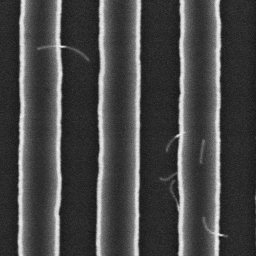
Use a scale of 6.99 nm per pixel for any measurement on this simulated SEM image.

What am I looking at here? lines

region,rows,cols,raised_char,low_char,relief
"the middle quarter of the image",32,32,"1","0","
00000000011111111110000000000111
00000000011111111110000000000111
00000000011111111110000000000111
00000000011111111110000000000111
00000000011111111110000000000111
00000000011111111110000000000111
00000000011111111110000000000111
00000000011111111110000000000111
00000000011111111110000000000111
00000000011111111110000000000111
00000000011111111110000000000111
00000000011111111110000000000111
00000000011111111110000000000111
00000000011111111110000000000111
00000000011111111110000000000111
00000000011111111110000000000111
00000000011111111110000000000111
00000000011111111110000000000111
00000000011111111110000000000111
00000000011111111110000000000111
00000000011111111110000000000111
00000000011111111100000000000111
00000000011111111110000000000111
00000000011111111110000000000111
00000000011111111110000000000111
00000000011111111110000000000111
00000000011111111100000000000111
00000000011111111100000000000111
00000000011111111100000000000111
00000000011111111100000000000111
00000000011111111100000000000111
00000000011111111100000000000111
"